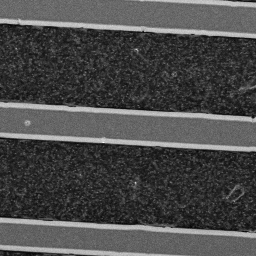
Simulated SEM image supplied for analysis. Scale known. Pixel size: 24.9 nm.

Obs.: one or a few lines or trenches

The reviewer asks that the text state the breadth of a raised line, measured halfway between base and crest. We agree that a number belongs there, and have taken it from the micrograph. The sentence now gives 759 nm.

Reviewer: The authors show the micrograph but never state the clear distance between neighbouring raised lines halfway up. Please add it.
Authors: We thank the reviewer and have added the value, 2100 nm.